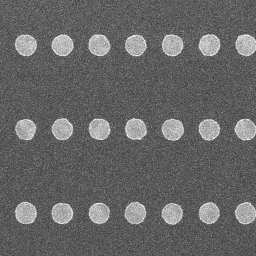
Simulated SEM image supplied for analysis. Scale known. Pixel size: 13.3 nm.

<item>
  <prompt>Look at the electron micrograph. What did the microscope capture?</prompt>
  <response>a regular array of raised bodies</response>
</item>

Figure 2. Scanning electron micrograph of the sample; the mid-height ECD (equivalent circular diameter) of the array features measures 276 nanometres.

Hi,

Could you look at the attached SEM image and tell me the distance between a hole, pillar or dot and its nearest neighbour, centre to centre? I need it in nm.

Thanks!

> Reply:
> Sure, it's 484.